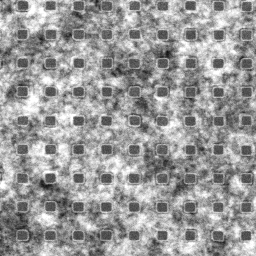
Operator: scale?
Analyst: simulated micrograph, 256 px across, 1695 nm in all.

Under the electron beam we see a regular array of raised bodies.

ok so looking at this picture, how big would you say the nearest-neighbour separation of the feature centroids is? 184 nm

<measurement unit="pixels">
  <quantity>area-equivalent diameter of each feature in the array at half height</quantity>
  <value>12.3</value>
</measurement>